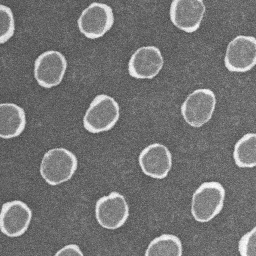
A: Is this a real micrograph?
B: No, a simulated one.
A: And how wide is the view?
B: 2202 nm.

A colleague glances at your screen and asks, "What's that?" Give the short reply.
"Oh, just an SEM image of a regular array of raised bodies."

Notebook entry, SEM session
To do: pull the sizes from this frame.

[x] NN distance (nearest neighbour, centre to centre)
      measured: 572 nm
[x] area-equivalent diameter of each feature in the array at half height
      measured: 32.6 px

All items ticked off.